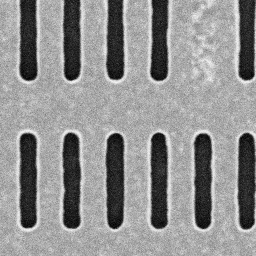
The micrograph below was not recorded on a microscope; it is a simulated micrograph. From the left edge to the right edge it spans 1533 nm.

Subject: holes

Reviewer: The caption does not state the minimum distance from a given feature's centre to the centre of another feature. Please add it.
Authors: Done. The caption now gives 261 nanometres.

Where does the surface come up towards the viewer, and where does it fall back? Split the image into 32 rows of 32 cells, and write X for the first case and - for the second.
XX---XXX--XXX--XXXX--XXXXXXXXX--
XX---XXX--XXX--XXXX--XXXXXXXXX--
XX---XXX--XXX--XXXX--XXXXXXXXX--
XX---XXX--XXX---XXX--XXXXXXXXX--
XX---XXX--XXX---XXX--XXXXXXXXX--
XX---XXX--XXX---XXX--XXXXXXXXX--
XX---XXX--XXX---XXX--XXXXXXXXX--
XX---XXX--XXX---XXX--XXXXXXXXX--
XX---XXX--XXX---XXX--XXXXXXXXX--
XX---XXX--XXX--XXXX--XXXXXXXXX--
XXXXXXXXXXXXXXXXXXXXXXXXXXXXXXXX
XXXXXXXXXXXXXXXXXXXXXXXXXXXXXXXX
XXXXXXXXXXXXXXXXXXXXXXXXXXXXXXXX
XXXXXXXXXXXXXXXXXXXXXXXXXXXXXXXX
XXXXXXXXXXXXXXXXXXXXXXXXXXXXXXXX
XXXXXXXXXXXXXXXXXXXXXXXXXXXXXXXX
XXX-XXXXXXXXXXXXXXXXXXXXXXXXXXXX
XX---XXX--XXX---XXX--XXX--XXXX--
XX---XXX--XXX---XXX--XXX---XXX--
XX---XXX--XXX---XXX--XXX---XXX--
XX---XXX--XXX---XXX--XXX---XXX--
XX---XXX--XXX---XXX--XXX---XXX--
XX---XXX--XXX---XXX--XXX---XXX--
XX---XXX--XXX---XXX--XXX---XXX--
XX---XXX--XXX---XXX--XXX---XXX--
XX---XXX--XXX---XXX--XXX---XXX--
XX---XXX--XXX---XXX--XXX--XXXX--
XX---XXX--XXX---XXX--XXX---XXX--
XXX-XXXX--XXXX-XXXX-XXXXX-XXXX-X
XXXXXXXXXXXXXXXXXXXXXXXXXXXXXXXX
XXXXXXXXXXXXXXXXXXXXXXXXXXXXXXXX
XXXXXXXXXXXXXXXXXXXXXXXXXXXXXXXX